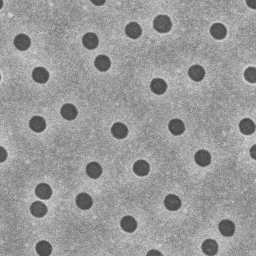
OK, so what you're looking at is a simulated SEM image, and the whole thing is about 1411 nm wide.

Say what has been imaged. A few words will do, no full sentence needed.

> a regular array of holes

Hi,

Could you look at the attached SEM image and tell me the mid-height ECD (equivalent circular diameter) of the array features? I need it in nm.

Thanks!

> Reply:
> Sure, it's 99.5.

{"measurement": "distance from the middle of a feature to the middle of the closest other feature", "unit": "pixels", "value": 37.9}